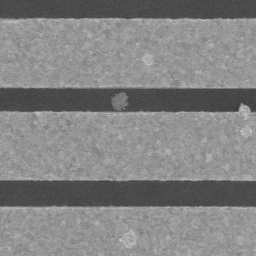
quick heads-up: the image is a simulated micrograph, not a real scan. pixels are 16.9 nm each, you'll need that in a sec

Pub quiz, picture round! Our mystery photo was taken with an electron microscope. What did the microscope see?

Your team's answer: lines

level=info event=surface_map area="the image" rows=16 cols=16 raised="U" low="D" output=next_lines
DDDDDDDDDDDDDDDD
UUUUUUUUUUUUUUUU
UUUUUUUUUUUUUUUU
UUUUUUUUUUUUUUUU
UUUUUUUUUUUUUUUU
DDDDDDDDDDDDDDDD
DDDDDDDDDDDDDDDD
UUUUUUUUUUUUUUUU
UUUUUUUUUUUUUUUU
UUUUUUUUUUUUUUUU
UUUUUUUUUUUUUUUU
DDDDDDDDDDDDDDDD
DDDDDDDDDDDDDDDD
UUUUUUUUUUUUUUUU
UUUUUUUUUUUUUUUU
UUUUUUUUUUUUUUUU